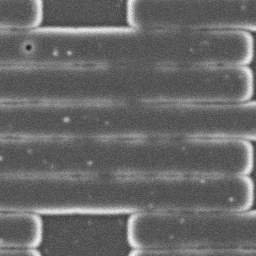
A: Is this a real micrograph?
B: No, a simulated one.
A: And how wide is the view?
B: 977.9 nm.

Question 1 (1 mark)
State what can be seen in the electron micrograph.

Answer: wiring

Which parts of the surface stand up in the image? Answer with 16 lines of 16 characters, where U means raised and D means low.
UUUDDDDDUUUUUUUU
UUUDDDDDUUUUUUUU
UUUUUUUUUUUUUUUU
UUUUUUUUUUUUUUUU
UUUUUUUUUUUUUUUU
UUUUUUUUUUUUUUUU
UUUUUUUUUUUUUUUU
UUUUUUUUUUUUUUUU
UUUUUUUUUUUUUUUU
UUUUUUUUUUUUUUUU
UUUUUUUUUUUUUUUU
UUUUUUUUUUUUUUUU
UUUUUUUUUUUUUUUU
UUUDDDDDUUUUUUUU
UUDDDDDDUUUUUUUU
UUDDDDDDUUUUUUUU